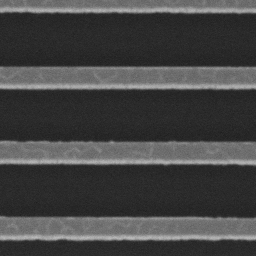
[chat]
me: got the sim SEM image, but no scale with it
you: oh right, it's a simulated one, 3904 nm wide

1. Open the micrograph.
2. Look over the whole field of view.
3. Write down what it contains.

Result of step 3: lines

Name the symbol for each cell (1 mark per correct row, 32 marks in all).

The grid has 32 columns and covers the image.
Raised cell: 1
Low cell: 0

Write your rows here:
11111111111111111111111111111111
00000000000000000110000011001111
00000000000000000000000000000000
00000000000000000000000000000000
00000000000000000000000000000000
00000000000000000000000000000000
00000000000000000000000000000000
00000000000000000000000000000000
11111111111111111111111111111111
11111111111111111111111111111111
11111111111111111111111111111111
00000000000000000000000000000000
00000000000000000000000000000000
00000000000000000000000000000000
00000000000000000000000000000000
00000000000000000000000000000000
00000000000000000000000000000000
00000000000000000000000000000000
11111111111111111111111111111111
11111111111111111111111111111111
00000000000000000000000000000000
00000000000000000000000000000000
00000000000000000000000000000000
00000000000000000000000000000000
00000000000000000000000000000000
00000000000000000000000000000000
00000000000000000000000000000000
11111111111111111111111111111111
11111111111111111111111111111111
11111111111111111111111111111111
00000000000000000000000000000000
00000000000000000000000000000000